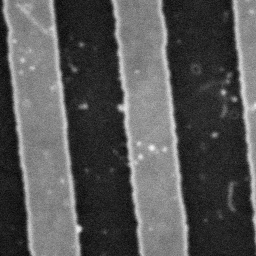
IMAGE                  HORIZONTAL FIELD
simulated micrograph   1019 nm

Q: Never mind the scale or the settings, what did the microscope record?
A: lines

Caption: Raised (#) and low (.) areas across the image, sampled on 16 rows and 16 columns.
###....###.....#
###....###.....#
####...###.....#
.###...###.....#
.###....###....#
.###....###....#
.###....###....#
.###....###....#
.###....###....#
.###....###.....
.###....###.....
..###...###.....
..###...###.....
..###....###....
..###....###....
..###....###....